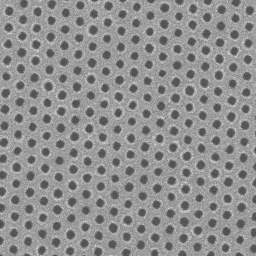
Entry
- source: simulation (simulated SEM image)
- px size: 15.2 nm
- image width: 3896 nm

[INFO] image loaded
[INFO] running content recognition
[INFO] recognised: a regular array of holes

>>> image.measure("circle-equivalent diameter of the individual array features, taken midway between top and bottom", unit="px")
8.82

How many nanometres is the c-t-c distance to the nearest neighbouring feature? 245